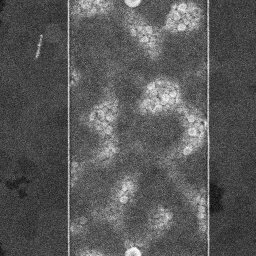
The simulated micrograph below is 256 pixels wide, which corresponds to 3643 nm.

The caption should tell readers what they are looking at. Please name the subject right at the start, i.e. one or a few lines or trenches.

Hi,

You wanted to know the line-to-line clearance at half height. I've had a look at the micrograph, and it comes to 1990 nanometres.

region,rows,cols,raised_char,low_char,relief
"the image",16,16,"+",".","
++++.........+++
++++.........+++
++++.........+++
++++.........+++
++++.........+++
++++.........+++
++++.........+++
++++.........+++
++++.........+++
++++.........+++
++++.........+++
++++.........+++
++++.........+++
++++.........+++
++++.........+++
++++.........+++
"